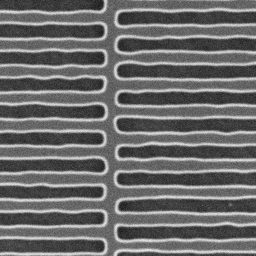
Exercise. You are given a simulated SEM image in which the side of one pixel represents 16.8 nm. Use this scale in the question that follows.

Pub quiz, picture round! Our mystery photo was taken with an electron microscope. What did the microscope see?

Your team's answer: groups of lines, slits or small figures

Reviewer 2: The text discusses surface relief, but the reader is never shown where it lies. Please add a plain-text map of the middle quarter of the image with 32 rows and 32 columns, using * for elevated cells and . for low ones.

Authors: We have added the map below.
.**......****...................
*************...................
*************...................
***.......****..................
..........**********************
..........**********************
..........*****************..***
*************...................
*************...................
*************...................
..........********........******
...........*********************
...........*********************
..........****........**********
*************...................
*************...................
*************...................
..........**********************
..........**********************
..........**********************
*****....*****..................
*************...................
*************...................
****.....*****..................
..........**********************
...........*********************
..........**********************
*************...................
*************...................
*************...................
.........*****..................
..........**********************